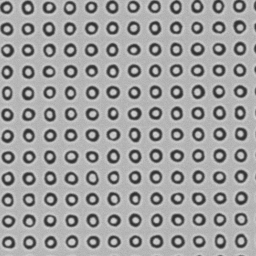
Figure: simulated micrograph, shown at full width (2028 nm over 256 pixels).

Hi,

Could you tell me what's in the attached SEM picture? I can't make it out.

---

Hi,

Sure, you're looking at a regular array of ring-shaped grooves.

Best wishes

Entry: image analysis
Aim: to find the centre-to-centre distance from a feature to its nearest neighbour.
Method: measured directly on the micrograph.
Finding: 163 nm